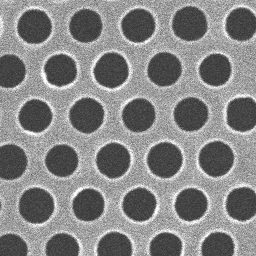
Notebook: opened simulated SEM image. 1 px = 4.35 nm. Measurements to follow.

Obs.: a regular array of holes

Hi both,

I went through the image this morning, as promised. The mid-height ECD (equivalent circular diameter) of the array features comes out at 151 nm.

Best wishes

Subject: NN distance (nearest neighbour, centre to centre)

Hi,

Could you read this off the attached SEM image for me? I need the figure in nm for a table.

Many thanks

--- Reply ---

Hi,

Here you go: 222